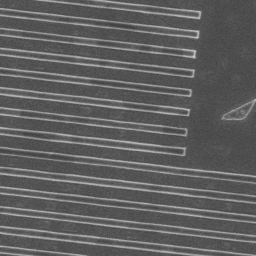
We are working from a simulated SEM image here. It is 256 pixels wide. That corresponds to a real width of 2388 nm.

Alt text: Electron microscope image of parallel lines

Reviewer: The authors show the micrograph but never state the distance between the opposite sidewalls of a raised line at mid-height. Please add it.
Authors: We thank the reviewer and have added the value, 64.9 nanometers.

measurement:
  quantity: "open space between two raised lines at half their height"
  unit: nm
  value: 115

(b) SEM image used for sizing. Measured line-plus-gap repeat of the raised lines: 0.183 µm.